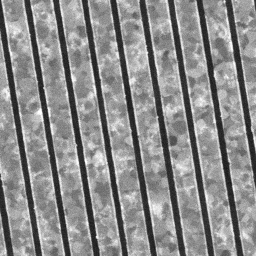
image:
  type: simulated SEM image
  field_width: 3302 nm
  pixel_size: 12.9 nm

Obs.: parallel lines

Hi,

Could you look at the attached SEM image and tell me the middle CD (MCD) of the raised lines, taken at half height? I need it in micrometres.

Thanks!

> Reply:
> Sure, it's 0.277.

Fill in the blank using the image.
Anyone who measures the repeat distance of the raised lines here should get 366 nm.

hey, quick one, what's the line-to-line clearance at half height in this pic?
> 0.0907 µm